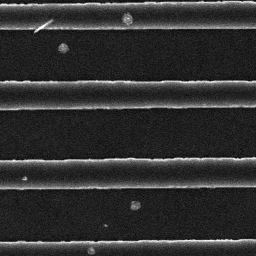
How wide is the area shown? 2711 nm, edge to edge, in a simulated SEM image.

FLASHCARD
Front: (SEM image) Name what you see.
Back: lines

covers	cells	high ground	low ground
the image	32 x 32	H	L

LLLLLLLLLLHHHHHHHHHHHHHHHHHHHHHH
HHHHHHHHHHHHHHHHHHHHHHHHHHHHHHHH
HHHHHHHHHHHHHHHHHHHHHHHHHHHHHHHH
HHHHHHHHHHHHHHHHHHHHHHHHHHHHHHHL
LLLLLLLLLLLLLLLLLLLLLLLLLLLLLLLL
LLLLLLLLLLLLLLLLLLLLLLLLLLLLLLLL
LLLLLLLLLLLLLLLLLLLLLLLLLLLLLLLL
LLLLLLLLLLLLLLLLLLLLLLLLLLLLLLLL
LLLLLLLLLLLLLLLLLLLLLLLLLLLLLLLL
LLLLLLLLLLLLLLLLLLLLLLLLLLLLLLLL
HHHHHHHHHHHHHHHHHHHHHHHHHHHHHHHH
HHHHHHHHHHHHHHHHHHHHHHHHHHHHHHHH
HHHHHHHHHHHHHHHHHHHHHHHHHHHHHHHH
HHHHHHHHHLLLLLLLLLLLLLLLLLLLLLLL
LLLLLLLLLLLLLLLLLLLLLLLLLLLLLLLL
LLLLLLLLLLLLLLLLLLLLLLLLLLLLLLLL
LLLLLLLLLLLLLLLLLLLLLLLLLLLLLLLL
LLLLLLLLLLLLLLLLLLLLLLLLLLLLLLLL
LLLLLLLLLLLLLLLLLLLLLLLLLLLLLLLL
LLLLLLLLLLLLLLLLLLLLLLLLLLLLLLLL
HHHHHHHHHHHHHHHHHHHHHHHHHHHHHHHH
HHHHHHHHHHHHHHHHHHHHHHHHHHHHHHHH
HHHHHHHHHHHHHHHHHHHHHHHHHHHHHHHH
HHHHHHHHLLLLLLLLLLLLLLLLLLLLLLLL
LLLLLLLLLLLLLLLLLLLLLLLLLLLLLLLL
LLLLLLLLLLLLLLLLLLLLLLLLLLLLLLLL
LLLLLLLLLLLLLLLLLLLLLLLLLLLLLLLL
LLLLLLLLLLLLLLLLLLLLLLLLLLLLLLLL
LLLLLLLLLLLLLLLLLLLLLLLLLLLLLLLL
LLLLLLLLLLLLLLLLLLLLLLLLLLLLLLLL
HHHHHHHHHHHHHHHHHHHHHHHHHHHHHHHH
HHHHHHHHHHHHHHHHHHHHHHHHHHHHHHHH